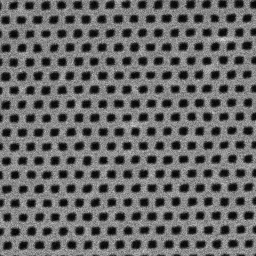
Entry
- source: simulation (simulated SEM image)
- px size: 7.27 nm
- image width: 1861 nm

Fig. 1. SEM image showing a regular array of holes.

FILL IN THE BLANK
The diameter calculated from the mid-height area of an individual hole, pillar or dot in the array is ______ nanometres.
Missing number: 70.5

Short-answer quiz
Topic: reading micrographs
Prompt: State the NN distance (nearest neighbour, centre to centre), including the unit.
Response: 0.115 microns